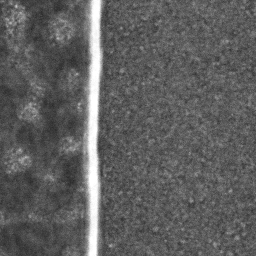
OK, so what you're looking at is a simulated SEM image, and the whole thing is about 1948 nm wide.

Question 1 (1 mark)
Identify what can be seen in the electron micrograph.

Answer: one or a few lines or trenches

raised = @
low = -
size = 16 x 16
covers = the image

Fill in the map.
@@@@@@----------
@@@@@@----------
@@@@@@----------
@@@@@@----------
@@@@@@----------
@@@@@@----------
@@@@@@----------
@@@@@@----------
@@@@@@----------
@@@@@@----------
@@@@@@----------
@@@@@@----------
@@@@@@----------
@@@@@@----------
@@@@@@----------
@@@@@@----------